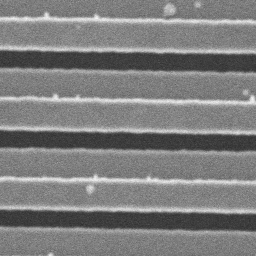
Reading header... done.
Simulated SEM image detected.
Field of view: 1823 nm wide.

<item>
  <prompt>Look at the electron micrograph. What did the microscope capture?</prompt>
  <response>lines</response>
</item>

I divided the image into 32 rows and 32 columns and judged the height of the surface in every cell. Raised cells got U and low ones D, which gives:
UUUUUUUUUUUUUUUUUUUUUUUUUUUUUUUU
UUUUUUUUUUUUUUUUUUUUUUUUUUUUUUUU
UUUUUUUUUUUUUUUUUUUUUUUUUUUUUUUU
UUUUUUUUUUUUUUUUUUUUUUUUUUUUUUUU
UUUUUUUUUUUUUUUUUUUUUUUUUUUUUUUU
UUUUUUUUUUUUUUUUUUUUUUUUUUUUUUUU
DDDDDDDDDDDDDDDDDDDUUDUUUUUUUUUU
DDDDDDDDDDDDDDDDDDDDDDDDDDDDDDDD
DDDDDDDDDDDDDDDDDDDDDDDDDDDDDDDD
UUUUUUUUUUUUUUUUUUUUUUUUUUUUUUUU
UUUUUUUUUUUUUUUUUUUUUUUUUUUUUUUU
UUUUUUUUUUUUUUUUUUUUUUUUUUUUUUUU
UUUUUUUUUUUUUUUUUUUUUUUUUUUUUUUU
UUUUUUUUUUUUUUUUUUUUUUUUUUUUUUUU
UUUUUUUUUUUUUUUUUUUUUUUUUUUUUUUU
UUUUUUUUUUUUUUUUUUUUUUUUUUUUUUUU
DDDDDDDDDDDDDDDDDUDUUUUUUUUUUUUU
DDDDDDDDDDDDDDDDDDDDDDDDDDDDDDDD
DDDDDDDDDDDDDDDDDDDDDDDDDDDDDDDD
UUUUUUUUUUUUUUUUUUUUUUUUUUUUUUUU
UUUUUUUUUUUUUUUUUUUUUUUUUUUUUUUU
UUUUUUUUUUUUUUUUUUUUUUUUUUUUUUUU
UUUUUUUUUUUUUUUUUUUUUUUUUUUUUUUU
UUUUUUUUUUUUUUUUUUUUUUUUUUUUUUUU
UUUUUUUUUUUUUUUUUUUUUUUUUUUUUUUU
UUUUUUUUUUUUUUUUUUUUUUUUUUUUUUUU
DDDDDDDDDDDDDDDDDDDDDDDDDDDUUUUU
DDDDDDDDDDDDDDDDDDDDDDDDDDDDDDDD
UUUUUUUUDUDDDDDDDDDDDDDDDDDDDDDD
UUUUUUUUUUUUUUUUUUUUUUUUUUUUUUUU
UUUUUUUUUUUUUUUUUUUUUUUUUUUUUUUU
UUUUUUUUUUUUUUUUUUUUUUUUUUUUUUUU